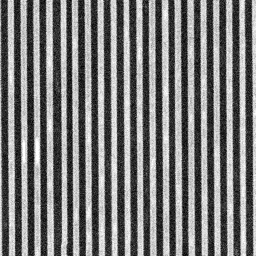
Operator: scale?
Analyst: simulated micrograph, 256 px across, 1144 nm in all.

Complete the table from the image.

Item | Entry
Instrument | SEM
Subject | parallel lines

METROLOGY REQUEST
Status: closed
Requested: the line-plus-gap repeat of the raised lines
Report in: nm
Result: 57.5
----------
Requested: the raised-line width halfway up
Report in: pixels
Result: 4.99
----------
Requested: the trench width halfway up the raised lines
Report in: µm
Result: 0.0346